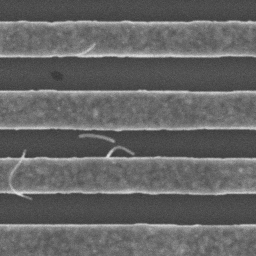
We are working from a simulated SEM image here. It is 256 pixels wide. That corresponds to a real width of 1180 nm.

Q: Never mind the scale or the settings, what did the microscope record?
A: lines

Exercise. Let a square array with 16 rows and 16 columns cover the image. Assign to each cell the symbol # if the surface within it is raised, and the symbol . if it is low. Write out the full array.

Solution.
................
################
################
####.##.######.#
................
................
################
################
................
................
################
################
................
................
################
################